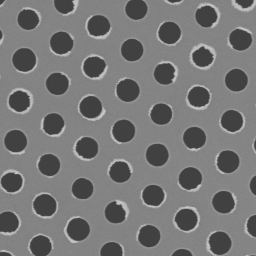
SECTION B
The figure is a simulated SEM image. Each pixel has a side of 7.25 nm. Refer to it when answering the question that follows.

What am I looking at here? a regular array of holes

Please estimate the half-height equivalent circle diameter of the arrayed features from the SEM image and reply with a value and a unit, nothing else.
21.8 px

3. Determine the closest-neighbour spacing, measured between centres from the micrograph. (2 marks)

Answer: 293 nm